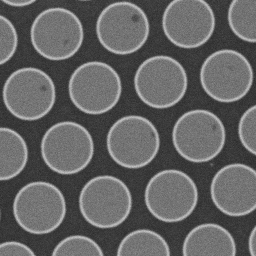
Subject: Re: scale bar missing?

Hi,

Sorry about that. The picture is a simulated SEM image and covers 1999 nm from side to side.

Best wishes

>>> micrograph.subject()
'an array of small figures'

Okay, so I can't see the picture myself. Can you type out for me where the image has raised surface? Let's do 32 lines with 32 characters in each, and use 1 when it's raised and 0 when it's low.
01110000000000111000011111000111
00000111100001111100011111100111
10001111110011111100111111100111
11001111110011111110111111100111
11001111110011111100011111000011
11001111110001111100001110000000
11000111100000111000000000011100
10000000000000000011110000111110
00000000001111000111111001111110
01111100011111100111111001111111
01111110011111100111111001111110
11111110011111100111111000111110
01111110011111100011110000011000
01111100001111000000000000000001
00111000000000000000000111100011
00000001110000111110001111110011
11000011111000111111001111110011
11100111111001111111001111110011
11100111111101111111001111110001
11100111111000111110000111100000
11100011111000011100000000000000
11000001110000000000111000011111
00000000000111100001111100011111
00011110000111110011111100111111
00111111001111110011111110111111
00111111001111110011111100011111
00111111001111110001111100001110
00111111000111100000111000000000
00011110000000000000000011110000
00000000000000001111000111111001
11100001111100011111100111111001
11110001111110011111100111111001